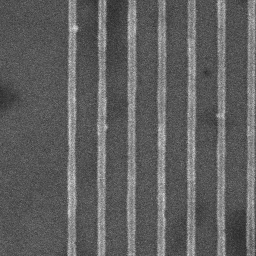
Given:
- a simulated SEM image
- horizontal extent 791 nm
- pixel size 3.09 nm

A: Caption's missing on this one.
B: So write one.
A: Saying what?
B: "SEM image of parallel lines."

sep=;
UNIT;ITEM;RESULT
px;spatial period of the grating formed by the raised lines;29.8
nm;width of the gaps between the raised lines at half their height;72.5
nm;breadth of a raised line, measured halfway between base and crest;18.9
